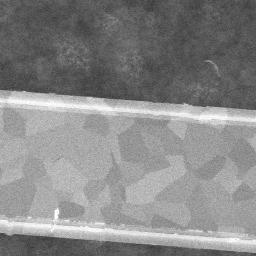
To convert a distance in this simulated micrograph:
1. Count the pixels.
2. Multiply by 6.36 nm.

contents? one or a few lines or trenches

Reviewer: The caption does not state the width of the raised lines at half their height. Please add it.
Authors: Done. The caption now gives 0.775 micrometres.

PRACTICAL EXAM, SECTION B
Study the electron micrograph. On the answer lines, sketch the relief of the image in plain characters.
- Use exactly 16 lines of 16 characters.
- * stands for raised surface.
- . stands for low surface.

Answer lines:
................
................
................
................
................
................
***.............
****************
****************
****************
****************
****************
****************
****************
........********
................